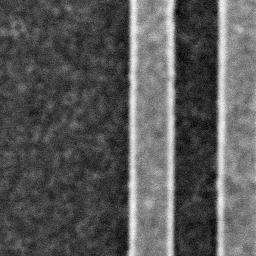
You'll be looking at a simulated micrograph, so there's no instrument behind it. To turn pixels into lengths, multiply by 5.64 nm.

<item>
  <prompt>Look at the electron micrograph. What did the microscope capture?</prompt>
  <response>one or a few lines or trenches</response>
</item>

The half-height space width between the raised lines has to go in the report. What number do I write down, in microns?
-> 0.276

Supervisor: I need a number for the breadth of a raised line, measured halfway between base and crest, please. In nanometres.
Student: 220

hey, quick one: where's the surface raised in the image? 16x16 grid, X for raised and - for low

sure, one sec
--------XXX---XX
--------XXX---XX
--------XXX---XX
--------XXX---XX
--------XXX---XX
--------XXX---XX
--------XXX---XX
--------XXX---XX
--------XXX---XX
--------XXX---XX
--------XXX---XX
--------XXX---XX
--------XXX---XX
--------XXX---XX
--------XXX---XX
--------XXX---XX